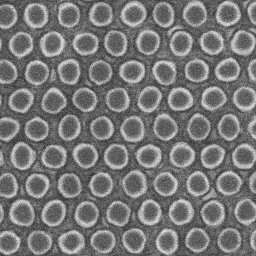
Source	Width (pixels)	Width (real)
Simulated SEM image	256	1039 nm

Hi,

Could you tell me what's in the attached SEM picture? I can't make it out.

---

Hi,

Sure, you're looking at a regular array of raised bodies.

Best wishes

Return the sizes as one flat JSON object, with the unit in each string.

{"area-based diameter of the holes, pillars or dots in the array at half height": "93 nanometers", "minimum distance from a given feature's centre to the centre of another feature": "125 nm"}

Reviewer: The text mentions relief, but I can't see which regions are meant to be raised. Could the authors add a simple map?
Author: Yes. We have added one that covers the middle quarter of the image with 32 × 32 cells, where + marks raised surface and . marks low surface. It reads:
++++...+++++..++++++...++++....+
++++..++++++..++++++..++++++..++
++++..++++++..++++++..++++++...+
++++..++++++..+++++....+++++...+
+++.....+++.....++......+++.....
................................
...+++......+++.....++++....++..
...+++++...+++++...+++++...++++.
..++++++...+++++...+++++..++++++
+.++++++...+++++...+++++..++++++
...+++++...+++++...++++...+++++.
....+++.....+++.....++..........
................................
+++......++.....++.....++++.....
++++...+++++...+++++...+++++...+
++++...+++++..++++++...+++++...+
++++...+++++..++++++...+++++...+
++++...+++++...+++++...+++++...+
+++.....+++....++++.....+++.....
................................
....+++....+++..............+++.
...+++++...++++....+++++...+++++
...+++++..++++++..++++++...+++++
...+++++..++++++..++++++...+++++
...+++++...+++++...++++....+++++
....+++.....+++.....++......++..
................................
+++.....+++.....+++.....++......
+++....+++++...+++++...++++....+
++++...+++++...+++++...+++++...+
++++...+++++...+++++...+++++...+
++++...+++++...+++++...+++++...+